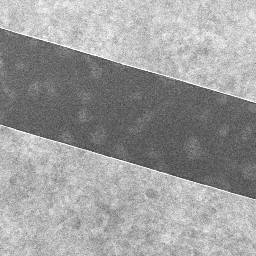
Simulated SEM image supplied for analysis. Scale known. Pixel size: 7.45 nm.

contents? one or a few lines or trenches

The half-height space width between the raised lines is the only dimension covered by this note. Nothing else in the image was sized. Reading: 698 nm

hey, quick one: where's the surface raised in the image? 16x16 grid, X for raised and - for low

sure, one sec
XXXXXXXXXXXXXXXX
XXXXXXXXXXXXXXXX
---XXXXXXXXXXXXX
------XXXXXXXXXX
---------XXXXXXX
-------------XXX
----------------
----------------
XX--------------
XXXXXX----------
XXXXXXXXX-------
XXXXXXXXXXXXX---
XXXXXXXXXXXXXXXX
XXXXXXXXXXXXXXXX
XXXXXXXXXXXXXXXX
XXXXXXXXXXXXXXXX